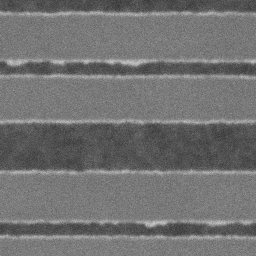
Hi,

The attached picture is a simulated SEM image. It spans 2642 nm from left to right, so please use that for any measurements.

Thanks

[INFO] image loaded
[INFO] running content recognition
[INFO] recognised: lines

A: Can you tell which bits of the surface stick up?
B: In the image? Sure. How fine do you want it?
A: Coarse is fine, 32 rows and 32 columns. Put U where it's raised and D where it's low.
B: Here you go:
DDDDDDDDDDDDDDDDDDDDDDDDDDDDDDDD
DDDDDDDDDDDDDDDDDDDDDDDDDDDDDDDD
UUUUUUUUUUUUUUUUUUUUUUUUUUUUUUUU
UUUUUUUUUUUUUUUUUUUUUUUUUUUUUUUU
UUUUUUUUUUUUUUUUUUUUUUUUUUUUUUUU
UUUUUUUUUUUUUUUUUUUUUUUUUUUUUUUU
UUUUUUUUUUUUUUUUUUUUUUUUUUUUUUUU
UUUUUUUUUUUUUUUUUUUUUUUUUUUUUUUU
DDDDDDDDDDDDDDDDDDDDDDDDDDDDDDDD
DUUUDDUUDDDDDDDDDDDDDDDDDDUDDDDD
UUUUUUUUUUUUUUUUUUUUUUUUUUUUUUUU
UUUUUUUUUUUUUUUUUUUUUUUUUUUUUUUU
UUUUUUUUUUUUUUUUUUUUUUUUUUUUUUUU
UUUUUUUUUUUUUUUUUUUUUUUUUUUUUUUU
UUUUUUUUUUUUUUUUUUUUUUUUUUUUUUUU
DDDDDDDDDDDDDDDDDDDDDDDDDDDDDDDD
DDDDDDDDDDDDDDDDDDDDDDDDDDDDDDDD
DDDDDDDDDDDDDDDDDDDDDDDDDDDDDDDD
DDDDDDDDDDDDDDDDDDDDDDDDDDDDDDDD
DDDDDDDDDDDDDDDDDDDDDDDDDDDDDDDD
DDDDDDDDDDDDDDDDDDDDDDDDDDDDDDDD
UUUUUUUUUUUUUUUUUUUUUUUUUUUUUUUU
UUUUUUUUUUUUUUUUUUUUUUUUUUUUUUUU
UUUUUUUUUUUUUUUUUUUUUUUUUUUUUUUU
UUUUUUUUUUUUUUUUUUUUUUUUUUUUUUUU
UUUUUUUUUUUUUUUUUUUUUUUUUUUUUUUU
UUUUUUUUUUUUUUUUUUUUUUUUUUUUUUUU
UUUUUUUUUUUUUUUUUUUUUUUUUUUUUUUU
DDDDDDDDDDDDDDDDDDDDDDDDDDDDDDDD
UDDDDDDDDDDDDDDDDDDDDDDDDDDDDDDD
UUUUUUUUUUUUUUUUUUUUUUUUUUUUUUUU
UUUUUUUUUUUUUUUUUUUUUUUUUUUUUUUU